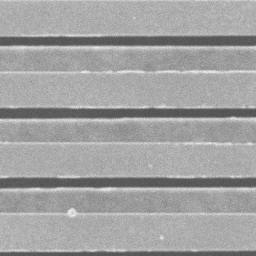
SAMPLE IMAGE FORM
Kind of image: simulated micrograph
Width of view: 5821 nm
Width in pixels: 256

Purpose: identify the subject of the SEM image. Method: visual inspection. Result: lines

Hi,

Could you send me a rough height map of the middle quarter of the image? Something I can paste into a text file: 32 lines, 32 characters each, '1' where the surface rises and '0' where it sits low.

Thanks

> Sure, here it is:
11111111111111111111111111111111
11111111111111111111111111111111
11111111111111111111111111111111
11111111111111111111111111111111
11111111111111111111111111111111
11111111111111111111111111111111
11111111111111111111111111111111
11111111111111111111111111111111
11111111111111111111111111111111
11111111111111111111111111111111
11111111111111111111111111111111
00000000000000000000000000000000
00000000000000000000000000000000
00000000000000000000000000000000
11111111111111111111111111111111
11111111111111111111111111111111
11111111111111111111111111111111
11111111111111111111111111111111
11111111111111111111111111111111
11111111111111111111111111111111
11111111111111111111111111111111
11111111111111111111111111111111
11111111111111111111111111111111
11111111111111111111111111111111
11111111111111111111111111111111
11111111111111111111111111111111
11111111111111111111111111111111
11111111111111111111111111111111
00000000000000000000000000000000
00000000000000000000000000000000
00000000000000000000000000000000
11111111111111111111111111111111